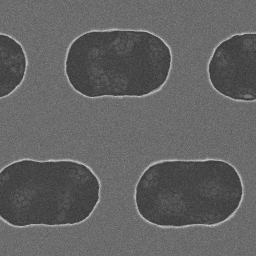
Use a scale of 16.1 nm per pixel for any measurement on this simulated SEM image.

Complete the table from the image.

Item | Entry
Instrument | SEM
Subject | holes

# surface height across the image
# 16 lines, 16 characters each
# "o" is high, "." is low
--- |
oooooooooooooooo
oooooooooooooooo
.oooo.....oooo..
.ooo.......oo...
..oo.......oo...
.oooo.....oooo..
oooooooooooooooo
oooooooooooooooo
oooooooooooooooo
oooooooooooooooo
.....oooo......o
......ooo......o
......ooo......o
.....oooo.....oo
oooooooooooooooo
oooooooooooooooo